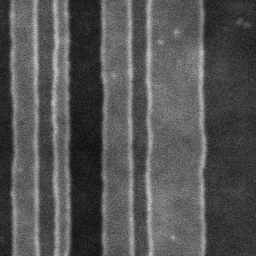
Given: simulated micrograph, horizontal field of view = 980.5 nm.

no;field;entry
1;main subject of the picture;lines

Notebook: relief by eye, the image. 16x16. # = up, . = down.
.###..#######...
.###..#######...
.###..#######...
.###..#######...
.###..#######...
.###...######...
.###...######...
.###..#######...
.###..#######...
.###..#######...
.###..#######...
.###..#######...
.###..#######...
.###..#######...
.###..#######...
.###..#######...